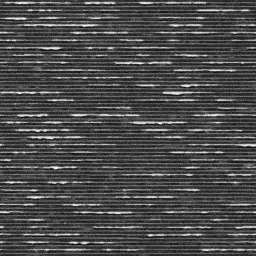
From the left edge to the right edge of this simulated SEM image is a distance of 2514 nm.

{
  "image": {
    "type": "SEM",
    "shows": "parallel lines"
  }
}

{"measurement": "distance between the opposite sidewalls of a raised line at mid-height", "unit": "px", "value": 4.76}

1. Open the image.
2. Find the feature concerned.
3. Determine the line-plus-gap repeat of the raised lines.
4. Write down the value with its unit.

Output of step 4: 7.47 px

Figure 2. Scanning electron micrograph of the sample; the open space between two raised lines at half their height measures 28.2 nanometers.